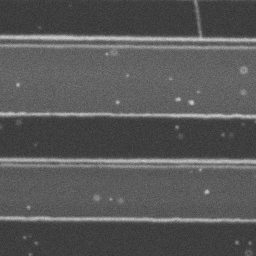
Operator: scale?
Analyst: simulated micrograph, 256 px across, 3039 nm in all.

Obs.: lines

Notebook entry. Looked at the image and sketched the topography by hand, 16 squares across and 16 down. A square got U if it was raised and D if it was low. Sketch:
UUUUUUUUUUUUUUUU
UUUUUUUUUUUUUUUU
DDDDDDDDDDDDDDDD
DDDDDDDDDDDDDDDD
DDDDDDDDDDDDDDDD
DDDDDDDDDDDDDDDD
DDDDDDDDDDDDDDDD
UUUUUUUUUUUUUUUU
UUUUUUUUUUUUUUUU
UUUUUUUUUUUUUUUU
DDDDDDDDDDDDDDDD
DDDDDDDDDDDDDDDD
DDDDDDDDDDDDDDDD
DDDDDDDDDDDDDDDD
UUUUUUUUUUUUUUUU
UUUUUUUUUUUUUUUU